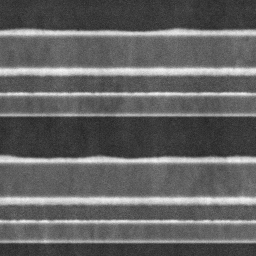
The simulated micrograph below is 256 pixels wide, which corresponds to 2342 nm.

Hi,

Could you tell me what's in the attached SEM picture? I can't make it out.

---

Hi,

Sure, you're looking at lines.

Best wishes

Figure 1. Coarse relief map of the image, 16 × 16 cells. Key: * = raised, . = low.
................
................
****************
****************
****************
****************
****************
................
................
................
****************
****************
****************
****************
****************
................